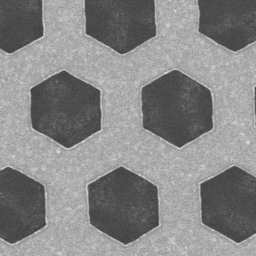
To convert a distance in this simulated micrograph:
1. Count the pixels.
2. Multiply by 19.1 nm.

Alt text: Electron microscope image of holes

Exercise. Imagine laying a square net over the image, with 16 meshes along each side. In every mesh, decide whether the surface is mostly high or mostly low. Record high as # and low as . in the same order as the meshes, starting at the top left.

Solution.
...##.....##....
...##.....##....
..####...####...
################
################
##....###....###
##....###....###
##....###....###
###...####...###
################
##############.#
...###....###...
...###....###...
...###....###...
..####...#####..
################